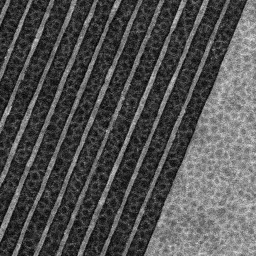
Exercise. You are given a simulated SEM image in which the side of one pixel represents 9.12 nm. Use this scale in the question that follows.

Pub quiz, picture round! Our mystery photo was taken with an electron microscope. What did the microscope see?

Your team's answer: parallel lines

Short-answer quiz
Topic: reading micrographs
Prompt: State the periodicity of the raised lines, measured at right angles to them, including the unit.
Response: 0.185 µm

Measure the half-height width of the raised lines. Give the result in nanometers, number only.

39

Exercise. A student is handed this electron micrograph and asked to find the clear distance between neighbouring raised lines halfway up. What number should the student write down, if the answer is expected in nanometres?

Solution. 151